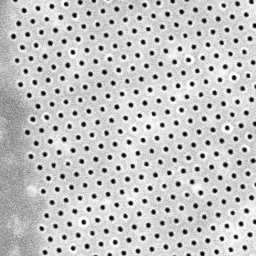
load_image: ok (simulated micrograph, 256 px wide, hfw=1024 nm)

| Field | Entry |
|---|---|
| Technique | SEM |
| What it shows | a regular array of holes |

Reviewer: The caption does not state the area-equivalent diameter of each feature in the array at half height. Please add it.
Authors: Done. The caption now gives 20.2 nm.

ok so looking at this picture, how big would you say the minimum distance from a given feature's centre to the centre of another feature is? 13.8 px